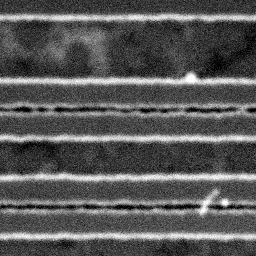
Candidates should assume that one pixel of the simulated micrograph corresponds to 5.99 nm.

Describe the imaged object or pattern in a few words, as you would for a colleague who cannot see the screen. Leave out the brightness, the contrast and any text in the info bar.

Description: lines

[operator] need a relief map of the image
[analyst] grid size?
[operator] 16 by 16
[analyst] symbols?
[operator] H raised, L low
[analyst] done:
HHHHHHHHHHHHHHHH
LLLLLLLLLLLLLLLL
LLLLLLLLLLLLLLLL
LLLLLLLLLLLLLLLL
LLLLLLLLLLLLLLLL
HHHHHHHHHHHHHHHH
HHHHHHHHHHHHHHHH
HHHHHHHHHHHHHHHH
HHHHHHHHHHHHHHHH
LLLLLLLLLLLLLLLL
LLLLLLLLLLLLLLLL
HHHHHHHHHHHHHHHH
HHHHHHHHHHHHHHHH
HHHHHHHHHHHHHHHH
HHHHHHHHHHHHHHHH
LLLLLLLLLLLLLLLL